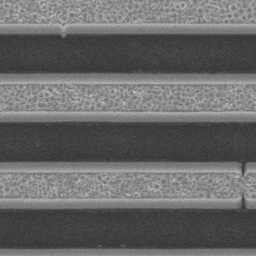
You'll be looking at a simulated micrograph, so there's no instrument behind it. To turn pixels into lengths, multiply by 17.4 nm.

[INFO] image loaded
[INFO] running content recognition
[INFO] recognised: one or a few lines or trenches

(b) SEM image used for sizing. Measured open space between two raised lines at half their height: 0.889 µm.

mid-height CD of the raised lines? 633 nanometres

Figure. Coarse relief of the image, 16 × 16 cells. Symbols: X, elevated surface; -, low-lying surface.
XXXXXXXXXXXXXXXX
XXXXXXXXXXXXXXXX
----------------
----------------
----------------
XXXXXXXXXXXXXXXX
XXXXXXXXXXXXXXXX
----------------
----------------
----------------
----------------
XXXXXXXXXXXXXXXX
XXXXXXXXXXXXXXXX
----------------
----------------
----------------